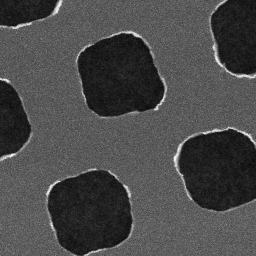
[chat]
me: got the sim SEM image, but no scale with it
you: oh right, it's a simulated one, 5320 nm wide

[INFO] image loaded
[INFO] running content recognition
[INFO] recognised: holes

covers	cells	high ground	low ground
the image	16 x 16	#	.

...###########..
.############...
######...####...
#####....#####..
#####.....####..
.####.....######
.####.....######
..##############
..##########...#
.##########.....
###########.....
####....####....
###.....####....
###.....########
###.....########
####...#########